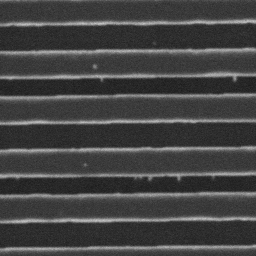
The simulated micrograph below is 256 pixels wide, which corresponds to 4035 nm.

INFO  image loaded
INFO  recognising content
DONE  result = lines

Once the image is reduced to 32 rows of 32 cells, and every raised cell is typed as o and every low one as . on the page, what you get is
oooooooooooooooooooooooooooooooo
oooooooooooooooooooooooooooooooo
oooooooooooooooooooooooooooooooo
................................
................................
................................
.....o.ooooooooooooooooooooooooo
oooooooooooooooooooooooooooooooo
oooooooooooooooooooooooooooooooo
ooooooooooooooooooooooooo.......
................................
................................
oooooooooooooooooooooooooooooooo
oooooooooooooooooooooooooooooooo
oooooooooooooooooooooooooooooooo
ooo.............................
................................
................................
....................oooooooooooo
oooooooooooooooooooooooooooooooo
oooooooooooooooooooooooooooooooo
oooooooooooooooooooooooooooooooo
................................
................................
oooooooooooooooooooooooooooooooo
oooooooooooooooooooooooooooooooo
oooooooooooooooooooooooooooooooo
oooooooooooooooo.oooo...........
................................
................................
................................
oooooooooooooooooooooooooooooooo